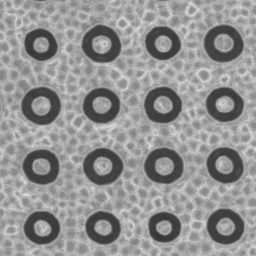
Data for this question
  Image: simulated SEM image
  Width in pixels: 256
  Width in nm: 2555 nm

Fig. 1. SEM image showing a regular array of ring-shaped grooves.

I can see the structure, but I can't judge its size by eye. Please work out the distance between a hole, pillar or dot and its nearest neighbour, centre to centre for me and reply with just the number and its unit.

60.5 px